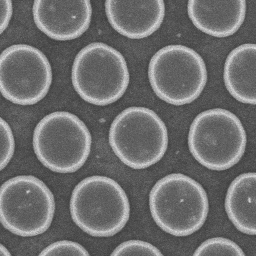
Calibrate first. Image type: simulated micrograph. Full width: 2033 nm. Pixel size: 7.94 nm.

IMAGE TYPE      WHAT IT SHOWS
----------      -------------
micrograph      raised bodies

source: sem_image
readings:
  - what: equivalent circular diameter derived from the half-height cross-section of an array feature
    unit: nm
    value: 440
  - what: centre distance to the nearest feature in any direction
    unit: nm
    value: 590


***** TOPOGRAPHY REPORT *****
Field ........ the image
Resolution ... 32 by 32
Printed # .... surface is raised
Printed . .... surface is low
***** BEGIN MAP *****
#....######..#######....######..
#...#######..#######....######..
#....######...######....######..
.....######....####......####...
.......##.......#...............
................................
.####.....####......####.....###
######....#####....######....###
######...#######...######...####
######...#######...######...####
######...#######...######...####
######....#####.....#####....###
..##.......###.......##.......##
................................
......###......####......####...
#....#####....######....######..
#....######...#######...######..
#...#######...#######...######..
#...#######...#######...######..
#....######....#####.....#####..
......####......###.......###...
................................
..##.......##........###......##
######....#####.....#####....###
######...######....######....###
######...#######...#######..####
######...#######...#######...###
######...#######....#####....###
.#####.....####......####.....##
................................
.......##.......##........###...
#....######....#####.....#####..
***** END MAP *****